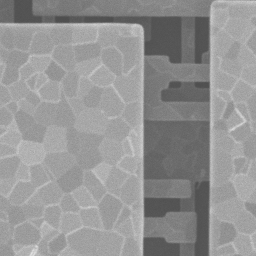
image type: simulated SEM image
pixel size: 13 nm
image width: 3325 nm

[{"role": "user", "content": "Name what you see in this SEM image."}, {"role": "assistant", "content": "wiring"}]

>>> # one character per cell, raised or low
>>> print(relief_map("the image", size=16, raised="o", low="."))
.............ooo
oooooooo.....ooo
ooooooooo....ooo
ooooooooo....ooo
ooooooooo....ooo
ooooooooo....ooo
ooooooooo....ooo
ooooooooo....ooo
ooooooooo....ooo
ooooooooo....ooo
ooooooooo....ooo
ooooooooo....ooo
ooooooooo....ooo
ooooooooo....ooo
ooooooooo....ooo
ooooooooo....ooo